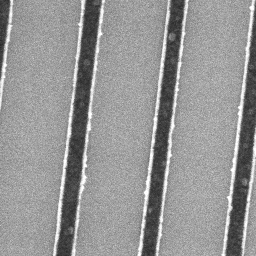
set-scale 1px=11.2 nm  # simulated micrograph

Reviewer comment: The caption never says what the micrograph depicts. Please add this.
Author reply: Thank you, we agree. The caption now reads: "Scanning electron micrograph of one or a few lines or trenches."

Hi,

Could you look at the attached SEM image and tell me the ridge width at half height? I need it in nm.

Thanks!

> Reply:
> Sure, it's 222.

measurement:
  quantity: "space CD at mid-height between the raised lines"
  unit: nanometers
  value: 721